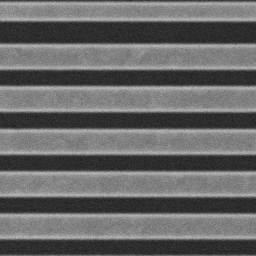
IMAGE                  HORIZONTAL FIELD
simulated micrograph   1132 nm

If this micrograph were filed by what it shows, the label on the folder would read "parallel lines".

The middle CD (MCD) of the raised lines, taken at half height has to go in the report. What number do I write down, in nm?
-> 108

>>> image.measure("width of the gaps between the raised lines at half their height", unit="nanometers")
79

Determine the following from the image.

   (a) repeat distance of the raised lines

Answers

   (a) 0.19 µm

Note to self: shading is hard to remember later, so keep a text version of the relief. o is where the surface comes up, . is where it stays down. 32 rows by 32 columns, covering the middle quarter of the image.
oooooooooooooooooooooooooooooooo
................................
................................
................................
................................
................................
oooooooooooooooooooooooooooooooo
oooooooooooooooooooooooooooooooo
oooooooooooooooooooooooooooooooo
oooooooooooooooooooooooooooooooo
oooooooooooooooooooooooooooooooo
oooooooooooooooooooooooooooooooo
................................
................................
................................
................................
................................
oooooooooooooooooooooooooooooooo
oooooooooooooooooooooooooooooooo
oooooooooooooooooooooooooooooooo
oooooooooooooooooooooooooooooooo
oooooooooooooooooooooooooooooooo
................................
................................
................................
................................
................................
oooooooooooooooooooooooooooooooo
oooooooooooooooooooooooooooooooo
oooooooooooooooooooooooooooooooo
oooooooooooooooooooooooooooooooo
oooooooooooooooooooooooooooooooo